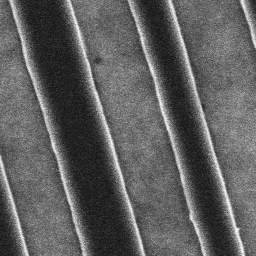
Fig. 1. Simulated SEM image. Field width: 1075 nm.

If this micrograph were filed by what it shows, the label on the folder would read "one or a few lines or trenches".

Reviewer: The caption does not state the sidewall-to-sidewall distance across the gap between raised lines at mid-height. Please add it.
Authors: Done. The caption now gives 0.24 µm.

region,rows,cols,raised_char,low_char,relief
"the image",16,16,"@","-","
-@@@----@@@----@
-@@@@----@@-----
-@@@@----@@-----
--@@@----@@@----
--@@@@---@@@----
--@@@@----@@----
---@@@----@@@---
---@@@@---@@@---
---@@@@----@@---
---@@@@----@@---
----@@@----@@@--
----@@@@---@@@--
@---@@@@----@@--
@----@@@----@@@-
@----@@@@---@@@-
@@---@@@@----@@-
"